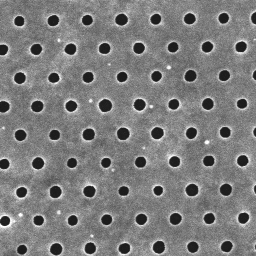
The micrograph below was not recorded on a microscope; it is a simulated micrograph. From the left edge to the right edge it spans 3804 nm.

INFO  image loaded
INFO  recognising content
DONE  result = a regular array of holes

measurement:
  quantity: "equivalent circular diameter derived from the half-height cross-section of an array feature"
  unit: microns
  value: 0.167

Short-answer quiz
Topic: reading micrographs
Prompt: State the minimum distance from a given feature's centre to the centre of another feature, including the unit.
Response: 490 nanometers